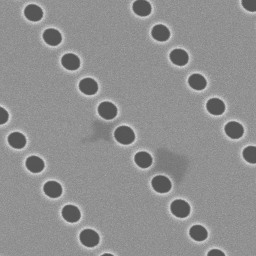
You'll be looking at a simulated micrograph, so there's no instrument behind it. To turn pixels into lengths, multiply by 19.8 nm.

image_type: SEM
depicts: a regular array of holes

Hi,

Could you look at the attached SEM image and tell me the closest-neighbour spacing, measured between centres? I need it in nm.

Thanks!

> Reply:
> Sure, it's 601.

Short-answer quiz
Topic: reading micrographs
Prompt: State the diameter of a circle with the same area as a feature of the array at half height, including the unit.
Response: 364 nm